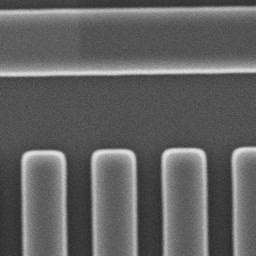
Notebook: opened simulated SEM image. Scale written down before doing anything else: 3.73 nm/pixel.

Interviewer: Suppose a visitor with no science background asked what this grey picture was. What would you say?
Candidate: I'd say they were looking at groups of lines, slits or small figures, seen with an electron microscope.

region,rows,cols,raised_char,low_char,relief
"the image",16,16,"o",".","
................
oooooooooooooooo
oooooooooooooooo
oooooooooooooooo
oooooooooo......
................
................
................
................
......oo...o...o
.ooo..oo..ooo..o
.ooo..oo..ooo..o
.ooo..oo..ooo..o
..oo..oo..ooo..o
..oo..oo..ooo..o
..oo..oo..ooo..o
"